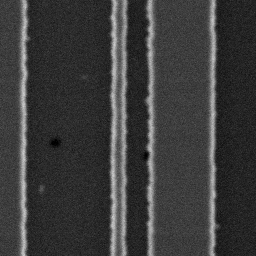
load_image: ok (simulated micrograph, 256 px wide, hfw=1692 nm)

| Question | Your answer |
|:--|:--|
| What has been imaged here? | lines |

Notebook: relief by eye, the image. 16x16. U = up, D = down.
UUDDDDDUUUUUUDDD
UUDDDDDUUUUUUDDD
UUDDDDDUUUUUUDDD
UUDDDDDUUUUUUDDD
UUDDDDDUUUUUUDDD
UUDDDDDUUUUUUDDD
UUDDDDDUUUUUUDDD
UUDDDDDUUUUUUDDD
UUDDDDDUUUUUUDDD
UUDDDDDUUUUUUDDD
UUDDDDDUUUUUUDDD
UUDDDDDUUUUUUDDD
UUDDDDDUUUUUUDDD
UUDDDDDUUUUUUDDD
UUDDDDDUUUUUUDDD
UUDDDDDUUUUUUDDD